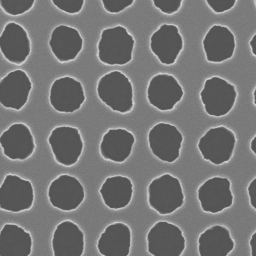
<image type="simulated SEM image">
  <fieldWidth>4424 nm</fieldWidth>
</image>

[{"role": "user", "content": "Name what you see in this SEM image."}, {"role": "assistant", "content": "a regular array of holes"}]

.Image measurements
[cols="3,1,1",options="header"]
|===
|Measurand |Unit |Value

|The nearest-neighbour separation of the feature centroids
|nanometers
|838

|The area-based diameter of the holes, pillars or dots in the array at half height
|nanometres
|603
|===